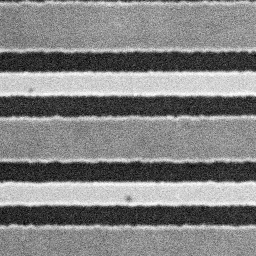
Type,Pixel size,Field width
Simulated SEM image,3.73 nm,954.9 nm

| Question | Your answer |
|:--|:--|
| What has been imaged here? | lines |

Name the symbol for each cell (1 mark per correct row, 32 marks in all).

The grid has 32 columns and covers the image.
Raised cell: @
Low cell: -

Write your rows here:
@@@@@@@@@@@@@@@@@@@@@@@@@@@@@@@@
@@@@@@@@@@@@@@@@@@@@@@@@@@@@@@@@
@@@@@@@@@@@@@@@@@@@@@@@@@@@@@@@@
@@@@@@@@@@@@@@@@@@@@@@@@@@@@@@@@
@@@@@@@@@@@@@@@@@@@@@@@@@@@@@@@@
@@@@@@@@@@@@@@@@@@@@@@@@@@@@@@@@
--------------------------------
--------------------------------
--------------------------------
@@@@@@@@@@@@@@@@@@@@@@@@@@@@@@@@
@@@@@@@@@@@@@@@@@@@@@@@@@@@@@@@@
@@@@@@@@@@@@@@@@@@@@@@@@@@@@@@@@
--------------------------------
--------------------------------
--------------------------------
@@@@@@@@@@@@@@@@@@@@@@@@@@@@@@@@
@@@@@@@@@@@@@@@@@@@@@@@@@@@@@@@@
@@@@@@@@@@@@@@@@@@@@@@@@@@@@@@@@
@@@@@@@@@@@@@@@@@@@@@@@@@@@@@@@@
@@@@@@@@@@@@@@@@@@@@@@@@@@@@@@@@
--------------------------------
--------------------------------
--------------------------------
@@@@@@@@@@@@@@@@@@@@@@@@@@@@@@@@
@@@@@@@@@@@@@@@@@@@@@@@@@@@@@@@@
@@@@@@@@@@@@@@@@@@@@@@@@@@@@@@@@
--------------------------------
--------------------------------
@@@@@@@@@@@@@@@@@@@@@@@@@@@@@@@@
@@@@@@@@@@@@@@@@@@@@@@@@@@@@@@@@
@@@@@@@@@@@@@@@@@@@@@@@@@@@@@@@@
@@@@@@@@@@@@@@@@@@@@@@@@@@@@@@@@